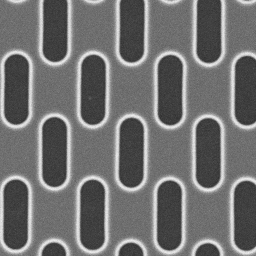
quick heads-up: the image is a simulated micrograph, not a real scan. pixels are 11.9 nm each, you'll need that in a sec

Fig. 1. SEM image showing groups of lines, slits or small figures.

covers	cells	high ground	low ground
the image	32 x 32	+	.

+++++....++++++...+++++++...++++
+++++....++++++...++++++....++++
+++++....++++++...++++++....++++
+++++....++++++...++++++....++++
+++++....++++++...++++++....++++
+++++....++++++...++++++....++++
+++++....++++++...++++++....++++
+...++..++...++...++...++..+++..
....++++++...+++++++...++++++...
....++++++...+++++++...++++++...
....++++++...+++++++...++++++...
....++++++...+++++++...++++++...
....++++++...+++++++...++++++...
....++++++...+++++++...++++++...
....++++++...+++++++...++++++...
+..++...+++.+++...++..+++..+++..
+++++....++++++...++++++....++++
+++++....++++++...++++++....++++
+++++....++++++...++++++....++++
+++++....++++++...++++++....++++
+++++....++++++...++++++....++++
+++++....++++++...++++++....++++
+..++...+++.+++...+++.++....++.+
....++++++...+++.+++...++..++...
....++++++...++++++....++++++...
....++++++...++++++....++++++...
....++++++...++++++....++++++...
....++++++...++++++....++++++...
....++++++...++++++....++++++...
....++++++...++++++....++++++...
+..+++..++...++..+++...++..++...
+++++...+++++++...++++++....++++